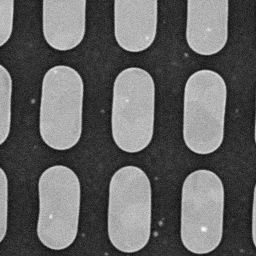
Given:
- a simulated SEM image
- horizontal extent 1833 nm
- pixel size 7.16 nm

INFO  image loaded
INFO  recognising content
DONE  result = groups of lines, slits or small figures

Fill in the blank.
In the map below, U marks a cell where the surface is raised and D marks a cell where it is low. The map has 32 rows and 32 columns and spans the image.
UUDDDUUUUUUDDDUUUUUUDDDDUUUUDDDD
UUDDDUUUUUUDDDUUUUUUDDDDUUUUDDDD
UUDDDUUUUUUDDDUUUUUUDDDUUUUUDDDD
UDDDDUUUUUUDDDUUUUUUDDDUUUUUDDDD
UDDDDDUUUUDDDDUUUUUDDDDUUUUUDDDD
DDDDDDUUUUDDDDDUUUUDDDDDUUUUDDDD
DDDDDDDDDDDDDDDDDDDDDDDDDUUDDDDD
DDDDDDDDDDDDDDDDDDDDDDDDDDDDDDDD
DDDDDDDUUDDDDDDDUDDDDDDDDDDDDDDD
UDDDDDUUUUDDDDDUUUUDDDDDUUUDDDDD
UDDDDUUUUUDDDDUUUUUDDDDUUUUUDDDD
UDDDDUUUUUDDDDUUUUUDDDDUUUUUDDDD
UDDDDUUUUUDDDDUUUUUDDDDUUUUUDDDD
UDDDDUUUUUDDDDUUUUUDDDDUUUUUDDDD
UDDDDUUUUUDDDDUUUUUDDDDUUUUUDDDD
UDDDDUUUUUDDDDUUUUUDDDDUUUUUDDDD
UDDDDUUUUUDDDDUUUUUDDDDUUUUUDDDD
UDDDDUUUUUDDDDUUUUUDDDDUUUUUDDDD
DDDDDDDUUDDDDDDUUUDDDDDDUUUDDDDD
DDDDDDDDDDDDDDDDDDDDDDDDDDDDDDDD
DDDDDDDDDDDDDDDDDDDDDDDDDDDDDDDD
DDDDDDUUUDDDDDDUUUDDDDDDUUDDDDDD
UDDDDUUUUUDDDDUUUUUDDDDUUUUDDDDD
UDDDDUUUUUDDDDUUUUUDDDDUUUUUDDDD
UDDDDUUUUUDDDDUUUUUDDDDUUUUUDDDD
UDDDDUUUUUDDDDUUUUUDDDDUUUUUDDDD
UDDDDUUUUUDDDDUUUUUDDDDUUUUUDDDD
UDDDDUUUUUDDDDUUUUUDDDDUUUUUDDDD
UDDDDUUUUUDDDDUUUUUDDDDUUUUUDDDD
UDDDDUUUUDDDDDUUUUUDDDDUUUUUDDDD
DDDDDUUUUDDDDDUUUUDDDDDUUUUDDDDD
DDDDDDDDDDDDDDDDUDDDDDDDUUDDDDDD